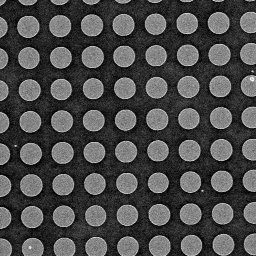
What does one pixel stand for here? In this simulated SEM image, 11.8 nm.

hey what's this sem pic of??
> an array of small figures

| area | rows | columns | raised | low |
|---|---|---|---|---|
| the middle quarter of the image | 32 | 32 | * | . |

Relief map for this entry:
*....****.....**................
................................
................................
......................**......**
*....****....****....****....***
**...*****...*****...*****..****
**...*****...*****...*****...***
**...*****...****....****....***
*.....***.....**................
................................
................................
......................***.....**
*....****....*****...*****...***
**...*****...*****...*****...***
**...*****...*****...*****...***
**...*****...*****...*****...***
*.....***......*.......*........
................................
................................
..............***.....***.....**
**...*****...*****...*****...***
**...*****...*****...*****...***
**...*****...*****...*****...***
**...*****...*****....***.....**
*......*........................
................................
................................
.......*.......**......**.....**
**....****....****...*****...***
**...*****...*****...*****...***
**...*****...*****...*****...***
**....****....****....***.....**